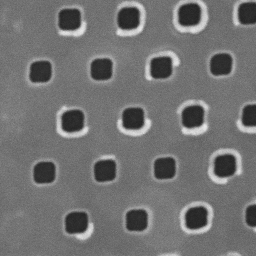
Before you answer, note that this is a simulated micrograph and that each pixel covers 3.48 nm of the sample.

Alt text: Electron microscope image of a regular array of holes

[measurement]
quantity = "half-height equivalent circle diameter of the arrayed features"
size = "84.6 nm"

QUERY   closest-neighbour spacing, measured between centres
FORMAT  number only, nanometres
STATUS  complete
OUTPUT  204